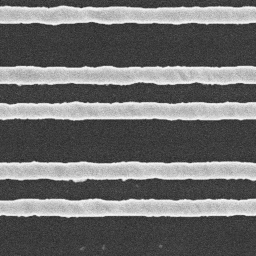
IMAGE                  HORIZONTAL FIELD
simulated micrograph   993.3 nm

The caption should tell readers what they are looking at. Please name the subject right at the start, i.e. lines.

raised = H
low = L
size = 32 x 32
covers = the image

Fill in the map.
LLLLLLLLLLLLLLLLLLLLLLLLLLLLLLLL
HHHHHHHHHHHHHHHHHHHHHHHHHHHHHHHH
HHHHHHHHHHHHHHHHHHHHHHHHHHHHHHHH
LLLLLLLLLLLLLLLLLLLLLLLLLLLLLLLL
LLLLLLLLLLLLLLLLLLLLLLLLLLLLLLLL
LLLLLLLLLLLLLLLLLLLLLLLLLLLLLLLL
LLLLLLLLLLLLLLLLLLLLLLLLLLLLLLLL
LLLLLLLLLLLLLLLLLLLLLLLLLLLLLLLL
HHHHHHHHHLHHHHHLHHHHHHHHHHHHHHHH
HHHHHHHHHHHHHHHHHHHHHHHHHHHHHHHH
LHHHHLHLLLLHHHHHLLLLHHLLLLHHHLLL
LLLLLLLLLLLLLLLLLLLLLLLLLLLLLLLL
LLLLLLLLLLLLLLLLLLLLLLLLLLLLLLLL
HHHHHHHHHHHHHHHHHHHHHHHHHHHHHHHH
HHHHHHHHHHHHHHHHHHHHHHHHHHHHHHHH
LLLLLLLLLLLLLLLLLLLLLLLLLLLLLLLL
LLLLLLLLLLLLLLLLLLLLLLLLLLLLLLLL
LLLLLLLLLLLLLLLLLLLLLLLLLLLLLLLL
LLLLLLLLLLLLLLLLLLLLLLLLLLLLLLLL
LLLLLLLLLLLLLLLLLLLLLLLLLLLLLLLL
HHHHHHHHHHHHHHHHHHHHHHHHHHHHHHHH
HHHHHHHHHHHHHHHHHHHHHHHHHHHHHHHH
LLLLLLLLLHLLLLLLLLLLLLLLLLLLLLLL
LLLLLLLLLLLLLLLLLLLLLLLLLLLLLLLL
LLLLLLLLLLLLLLLLLLLLLLLLLLLLLLLL
HHHHHHHHHHHHHHHHHHHHHHHHHHHHHHHH
HHHHHHHHHHHHHHHHHHHHHHHHHHHHHHHH
LLLLLLLLLLLLLLLLLLLLLLLLLLLLLLLL
LLLLLLLLLLLLLLLLLLLLLLLLLLLLLLLL
LLLLLLLLLLLLLLLLLLLLLLLLLLLLLLLL
LLLLLLLLLLLLLLLLLLLLLLLLLLLLLLLL
LLLLLLLLLLLLLLLLLLLLLLLLLLLLLLLL